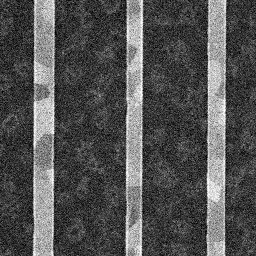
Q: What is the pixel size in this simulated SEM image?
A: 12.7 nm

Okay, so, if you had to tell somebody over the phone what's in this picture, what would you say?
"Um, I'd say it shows one or a few lines or trenches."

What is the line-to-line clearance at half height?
890 nanometres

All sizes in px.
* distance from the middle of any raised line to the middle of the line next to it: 86.2